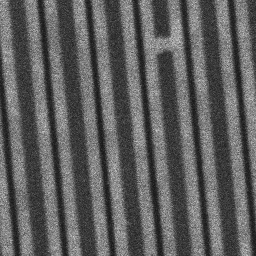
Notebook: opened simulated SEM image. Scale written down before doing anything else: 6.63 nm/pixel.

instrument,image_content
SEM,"parallel lines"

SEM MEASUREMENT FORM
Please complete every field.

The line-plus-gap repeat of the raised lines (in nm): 159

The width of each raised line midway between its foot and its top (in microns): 0.0883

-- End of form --